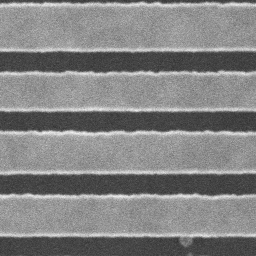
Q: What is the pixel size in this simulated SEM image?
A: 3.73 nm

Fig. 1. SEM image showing lines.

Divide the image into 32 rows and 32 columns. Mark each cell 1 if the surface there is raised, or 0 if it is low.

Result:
11111111110111101111011101111111
11111111111111111111111111111111
11111111111111111111111111111111
11111111111111111111111111111111
11111111111111111111111111111111
11111111111111111111111111111111
00000000000000000000000000000000
00000000000000000000000000000000
00000000000000000000000000000000
11111111111111111111111111111111
11111111111111111111111111111111
11111111111111111111111111111111
11111111111111111111111111111111
11111111111111111111111111111111
00000000000000000000000000000000
00000000000000000000000000000000
11111111111000110111011111111001
11111111111111111111111111111111
11111111111111111111111111111111
11111111111111111111111111111111
11111111111111111111111111111111
11111111111111111111111111111111
00000000000000000000000000000000
00000000000000000000000000000000
11111111111111111111111111111111
11111111111111111111111111111111
11111111111111111111111111111111
11111111111111111111111111111111
11111111111111111111111111111111
01110001001100100001110111110001
00000000000000000000000000000000
00000000000000000000000000000000